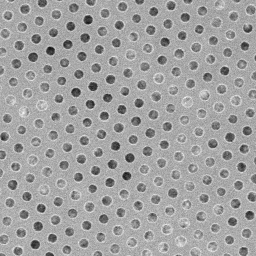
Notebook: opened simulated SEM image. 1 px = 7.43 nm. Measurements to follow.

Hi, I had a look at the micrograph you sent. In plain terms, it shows a regular array of holes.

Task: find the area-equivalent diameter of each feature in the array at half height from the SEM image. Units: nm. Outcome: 72.1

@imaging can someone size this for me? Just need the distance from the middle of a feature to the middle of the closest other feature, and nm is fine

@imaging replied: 135